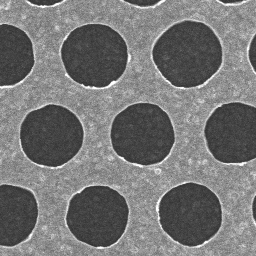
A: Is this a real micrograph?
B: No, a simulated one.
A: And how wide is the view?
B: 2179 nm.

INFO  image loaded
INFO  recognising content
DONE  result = holes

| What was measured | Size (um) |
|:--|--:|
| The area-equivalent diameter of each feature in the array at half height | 0.539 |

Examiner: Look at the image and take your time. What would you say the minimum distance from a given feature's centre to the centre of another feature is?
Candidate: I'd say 91.7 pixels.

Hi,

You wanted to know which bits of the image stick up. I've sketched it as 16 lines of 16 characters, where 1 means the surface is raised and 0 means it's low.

1111111111111111
1111111111100111
0011000011000011
0011000011000011
0011000011000111
1111111111111111
1111111101111101
1000011000011000
1000011000011000
1100011000011000
1111111111111111
1111111111111111
0011000011000011
0011000011000011
0011000011000011
1111111111111111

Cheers